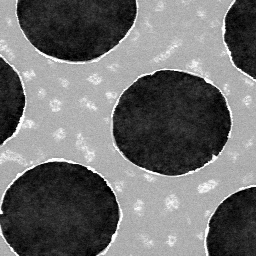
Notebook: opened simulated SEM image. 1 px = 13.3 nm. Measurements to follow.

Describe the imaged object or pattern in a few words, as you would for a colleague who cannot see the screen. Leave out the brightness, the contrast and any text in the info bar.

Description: holes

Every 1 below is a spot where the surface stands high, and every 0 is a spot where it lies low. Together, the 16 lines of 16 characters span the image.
1000000001111100
1000000011111100
1100000011111100
1110001111111100
0111111111011110
0111111100000111
0011111000000011
0111111000000011
0111111000000011
1111111100000011
1100011110001111
1000000111111111
0000000111111100
0000000111111000
0000000111111000
1000000111111000